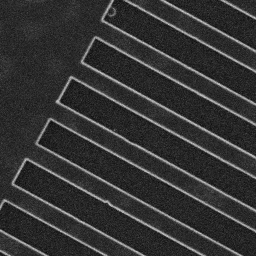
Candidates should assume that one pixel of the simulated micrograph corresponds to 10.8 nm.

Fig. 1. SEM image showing parallel lines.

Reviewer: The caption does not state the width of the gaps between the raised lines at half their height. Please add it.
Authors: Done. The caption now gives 0.303 um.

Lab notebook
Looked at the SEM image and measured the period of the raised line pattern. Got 505 nm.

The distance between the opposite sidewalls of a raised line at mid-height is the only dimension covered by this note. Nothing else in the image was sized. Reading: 0.202 um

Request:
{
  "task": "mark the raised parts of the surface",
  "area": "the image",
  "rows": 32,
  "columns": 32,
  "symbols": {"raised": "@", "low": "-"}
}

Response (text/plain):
@@@@@@@@@@@@@@--@@@@@-------@@@@
@@@@@@@@@@@@@-----@@@@@-------@@
@@@@@@@@@@@@@-------@@@@@-------
@@@@@@@@@@@@@@@-------@@@@@-----
@@@@@@@@@@@@@@@@--------@@@@----
@@@@@@@@@@@--@@@@@--------@@@@--
@@@@@@@@@@@----@@@@@-------@@@@@
@@@@@@@@@@-------@@@@@-------@@@
@@@@@@@@@@@@-------@@@@@-------@
@@@@@@@@@@@@@--------@@@@-------
@@@@@@@@@-@@@@@--------@@@@-----
@@@@@@@@----@@@@@-------@@@@@---
@@@@@@@-------@@@@@-------@@@@@-
@@@@@@@@@-------@@@@@-------@@@@
@@@@@@@@@@--------@@@@@-------@@
@@@@@@-@@@@@--------@@@@--------
@@@@@----@@@@@-------@@@@@------
@@@@@------@@@@@-------@@@@@----
@@@@@@-------@@@@@-------@@@@@--
@@@@@@@--------@@@@@-------@@@@@
@@@-@@@@@--------@@@@--------@@@
@@----@@@@@-------@@@@@-------@@
@@------@@@@@-------@@@@@-------
@@@-------@@@@@-------@@@@@-----
@@@@--------@@@@@-------@@@@@---
-@@@@@--------@@@@--------@@@@--
---@@@@@-------@@@@@--------@@@@
-----@@@@@-------@@@@@-------@@@
-------@@@@@-------@@@@@-------@
@--------@@@@@-------@@@@@------
@@@--------@@@@--------@@@@-----
@@@@@-------@@@@@--------@@@@---